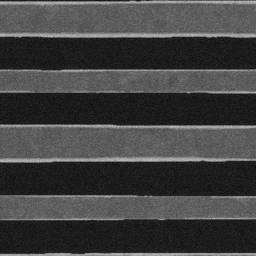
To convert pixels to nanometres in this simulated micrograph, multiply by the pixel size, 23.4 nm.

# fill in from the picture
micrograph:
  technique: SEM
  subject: lines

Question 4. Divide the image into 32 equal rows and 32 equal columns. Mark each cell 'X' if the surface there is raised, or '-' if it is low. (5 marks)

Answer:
XXXXXXXXXXXXXXXXXXXXXXXXXXXXXXXX
XXXXXXXXXXXXXXXXXXXXXXXXXXXXXXXX
XXXXXXXXXXXXXXXXXXXXXXXXXXXXXXXX
XXXXXXXXXXXXXXXXXXXXXXXXXXXXXXXX
------XXXXXXXXX-XXXXXX---XXXXXXX
--------------------------------
--------------------------------
--------------------------------
--------------------------------
XXXXXXXXXXXXXXXXXXXXXXXXXXXXXXXX
XXXXXXXXXXXXXXXXXXXXXXXXXXXXXXXX
---------------------------XX---
--------------------------------
--------------------------------
--------------------------------
--------------------------------
XXXXXXXXXXXXXXXXXXXXXXXXXXXXXXXX
XXXXXXXXXXXXXXXXXXXXXXXXXXXXXXXX
XXXXXXXXXXXXXXXXXXXXXXXXXXXXXXXX
XXXXXXXXXXXXXXXXXXXXXXXXXXXXXXXX
--------------------------------
--------------------------------
--------------------------------
--------------------------------
--------------------------------
XXXXXXXXXXXXXXXXXXXXXXXXXXXXXXXX
XXXXXXXXXXXXXXXXXXXXXXXXXXXXXXXX
--------------------------------
--------------------------------
--------------------------------
--------------------------------
--------------------------------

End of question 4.